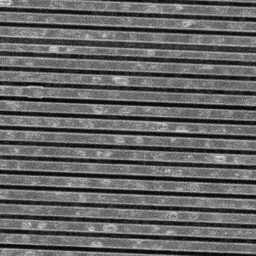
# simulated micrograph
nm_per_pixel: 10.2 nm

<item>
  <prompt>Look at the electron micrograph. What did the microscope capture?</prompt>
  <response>parallel lines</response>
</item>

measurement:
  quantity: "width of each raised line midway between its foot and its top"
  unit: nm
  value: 99.9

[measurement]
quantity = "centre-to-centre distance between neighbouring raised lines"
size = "0.151 µm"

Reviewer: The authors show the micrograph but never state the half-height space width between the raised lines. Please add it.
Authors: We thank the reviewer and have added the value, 46.1 nm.